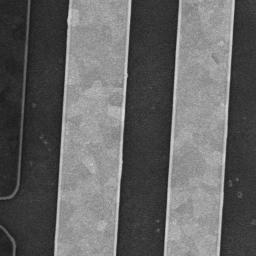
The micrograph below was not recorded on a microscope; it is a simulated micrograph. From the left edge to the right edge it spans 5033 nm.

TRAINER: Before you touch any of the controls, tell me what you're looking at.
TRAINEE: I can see one or a few lines or trenches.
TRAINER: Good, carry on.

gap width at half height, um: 0.969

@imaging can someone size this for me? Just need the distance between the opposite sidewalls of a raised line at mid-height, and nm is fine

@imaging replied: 1120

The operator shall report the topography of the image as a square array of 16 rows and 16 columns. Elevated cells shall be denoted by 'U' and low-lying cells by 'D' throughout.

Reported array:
UUDDUUUUDDDUUUUD
UUDDUUUUDDDUUUUD
UUDDUUUUDDDUUUDD
UUDDUUUUDDDUUUDD
UUDDUUUUDDDUUUDD
UUDDUUUUDDDUUUDD
UDDDUUUUDDDUUUDD
UDDDUUUUDDDUUUDD
UDDDUUUUDDDUUUDD
UDDDUUUUDDDUUUDD
UDDDUUUUDDDUUUDD
UDDDUUUDDDDUUUDD
DDDDUUUDDDDUUUDD
DDDDUUUDDDUUUUDD
DDDDUUUDDDUUUUDD
UDDUUUUDDDUUUUDD